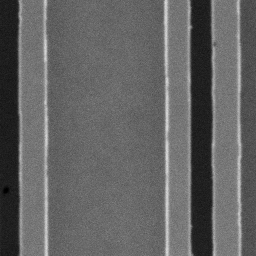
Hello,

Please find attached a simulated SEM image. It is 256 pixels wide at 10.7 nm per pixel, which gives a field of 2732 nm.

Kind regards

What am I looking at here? lines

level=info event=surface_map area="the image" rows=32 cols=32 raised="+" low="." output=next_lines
..++++...............+++...+++..
..++++...............+++...+++..
..++++...............+++...+++..
..++++...............+++...+++..
..++++...............+++...+++..
..++++...............+++...+++..
..++++...............+++...+++..
..++++...............+++...+++..
..++++...............+++...+++..
..++++...............+++...+++..
..++++...............+++...+++..
..++++...............+++...+++..
..++++...............+++...+++..
..++++...............+++...+++..
..++++...............+++...+++..
...+++...............+++...+++..
...+++...............+++...+++..
..++++...............+++...+++..
..++++...............+++...+++..
..++++...............+++...+++..
..++++...............+++...+++..
..++++...............+++...+++..
..++++...............+++...+++..
...+++...............+++...+++..
...+++...............+++...+++..
...+++...............+++...+++..
...+++...............+++...+++..
...+++...............+++...+++..
...+++...............+++...+++..
...+++...............+++...+++..
...+++...............+++...+++..
...+++...............+++...+++..